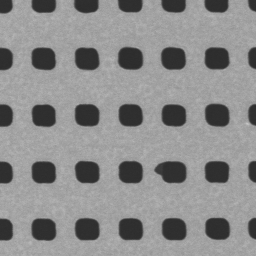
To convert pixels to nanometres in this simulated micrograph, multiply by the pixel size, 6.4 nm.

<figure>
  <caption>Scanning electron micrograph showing a regular array of holes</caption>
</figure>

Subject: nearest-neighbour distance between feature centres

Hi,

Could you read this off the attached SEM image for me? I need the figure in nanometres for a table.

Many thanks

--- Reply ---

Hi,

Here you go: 276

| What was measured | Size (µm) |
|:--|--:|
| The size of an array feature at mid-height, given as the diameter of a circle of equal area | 0.154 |